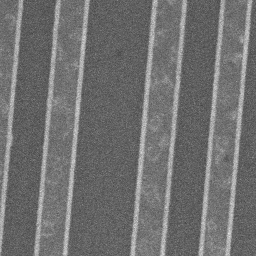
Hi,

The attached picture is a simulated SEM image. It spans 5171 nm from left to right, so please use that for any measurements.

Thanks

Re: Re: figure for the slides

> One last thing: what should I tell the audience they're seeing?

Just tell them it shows one or a few lines or trenches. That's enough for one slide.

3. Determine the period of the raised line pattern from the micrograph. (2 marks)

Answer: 1650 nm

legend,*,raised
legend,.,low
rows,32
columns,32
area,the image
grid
***....****........****.....***.
**.....****........****.....***.
**.....****........****.....***.
**.....****........****.....***.
**.....***.........****.....***.
**.....***.........****....****.
**.....***.........****....****.
**.....***.........***.....****.
**.....***.........***.....***..
**....****.........***.....***..
**....****........****.....***..
**....****........****.....***..
**....****........****.....***..
*.....****........****.....***..
*.....****........****.....***..
*.....***.........****.....***..
*.....***.........****....****..
*.....***.........****....****..
*.....***.........***.....****..
*.....***.........***.....***...
*.....***.........***.....***...
*....****.........***.....***...
*....****........****.....***...
.....****........****.....***...
.....****........****.....***...
.....****........****.....***...
.....****........****.....***...
.....***.........****.....***...
.....***.........****....****...
.....***.........***.....****...
.....***.........***.....***....
.....***.........***.....***....